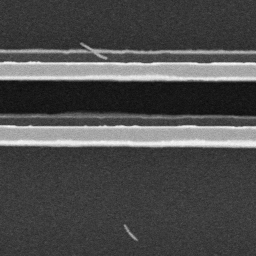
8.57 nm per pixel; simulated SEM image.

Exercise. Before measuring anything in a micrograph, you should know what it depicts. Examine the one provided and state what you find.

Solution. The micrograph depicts lines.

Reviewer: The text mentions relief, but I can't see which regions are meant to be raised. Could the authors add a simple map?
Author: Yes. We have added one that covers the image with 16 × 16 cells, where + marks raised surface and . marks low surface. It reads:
................
................
................
++++++++++++++++
++++++++++++++++
................
................
++++++++++++++++
++++++++++++++++
................
................
................
................
................
................
................